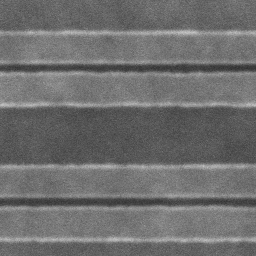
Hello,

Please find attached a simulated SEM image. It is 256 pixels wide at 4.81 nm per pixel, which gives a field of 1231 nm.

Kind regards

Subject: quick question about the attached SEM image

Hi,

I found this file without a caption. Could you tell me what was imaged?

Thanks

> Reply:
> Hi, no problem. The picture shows lines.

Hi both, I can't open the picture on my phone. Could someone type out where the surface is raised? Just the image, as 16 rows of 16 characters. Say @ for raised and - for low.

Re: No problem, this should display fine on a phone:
----------------
----------------
@@@@@@@@@@@@@@@@
@@@@@@@@@@@@@@@@
@@@@@@@@@@@@@@@@
@@@@@@@@@@@@@@@@
@@@@@@@@@@@@@@@@
----------------
----------------
----------------
@@@@@@@@@@@@@@@@
@@@@@@@@@@@@@@@@
@@@@@@@@@@@@@@@@
@@@@@@@@@@@@@@@@
@@@@@@@@@@@@@@@@
----------------